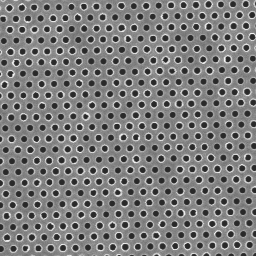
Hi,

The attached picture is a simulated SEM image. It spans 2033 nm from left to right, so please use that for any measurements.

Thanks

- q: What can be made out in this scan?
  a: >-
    a regular array of holes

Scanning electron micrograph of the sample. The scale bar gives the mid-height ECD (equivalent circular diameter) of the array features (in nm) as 45.7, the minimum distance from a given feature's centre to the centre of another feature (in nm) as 96.7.